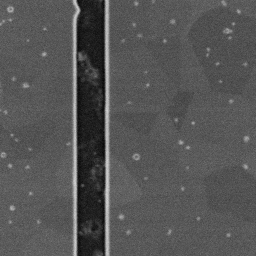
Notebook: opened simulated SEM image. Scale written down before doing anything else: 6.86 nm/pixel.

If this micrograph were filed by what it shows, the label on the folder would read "one or a few lines or trenches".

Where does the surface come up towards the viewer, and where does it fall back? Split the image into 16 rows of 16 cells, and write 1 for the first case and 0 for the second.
1111100111111111
1111100111111111
1111100111111111
1111100111111111
1111100111111111
1111100111111111
1111100111111111
1111100111111111
1111100111111111
1111100111111111
1111100111111111
1111100111111111
1111100111111111
1111100111111111
1111100111111111
1111100111111111